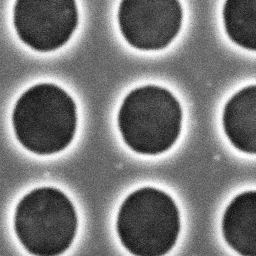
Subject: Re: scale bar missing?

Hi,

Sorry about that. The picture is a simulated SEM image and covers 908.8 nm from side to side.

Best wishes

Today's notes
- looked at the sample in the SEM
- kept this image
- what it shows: holes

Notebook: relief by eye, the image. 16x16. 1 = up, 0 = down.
1000011000011100
1000011000011100
1000111100011100
1111111111111111
1111111111111111
1100111100111110
1000011100011100
1000011000011100
1000011100011100
1100111100111110
1111111111111111
1111111111111111
1000111100011100
1000011000011100
1000011000011100
1000111100011100